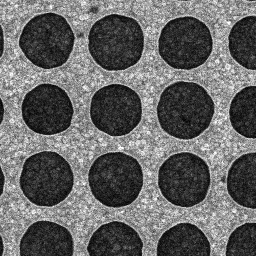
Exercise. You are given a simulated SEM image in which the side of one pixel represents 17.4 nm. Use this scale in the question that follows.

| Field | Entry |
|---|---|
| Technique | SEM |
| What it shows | a regular array of holes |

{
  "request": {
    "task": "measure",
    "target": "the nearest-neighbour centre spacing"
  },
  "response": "1190 nanometers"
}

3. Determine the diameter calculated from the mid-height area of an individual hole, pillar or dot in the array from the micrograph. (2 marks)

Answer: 0.952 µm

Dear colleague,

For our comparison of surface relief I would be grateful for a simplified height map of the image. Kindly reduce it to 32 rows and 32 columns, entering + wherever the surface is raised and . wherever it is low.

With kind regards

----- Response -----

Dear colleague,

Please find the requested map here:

++++++++++++++++++++++++++++++++
++++++++++++++++++++++++++++++++
++++....++++.....++++....+++++..
+++......++.......++......+++...
+++......++.......++......+++...
++.......++.......++.......++...
+++......++.......++......+++...
++++....++++.....+++......+++...
+++++..++++++...++++++..+++++++.
++++++++++++++++++++++++++++++++
++++++++++++++.++++++....+++++++
++++....++++.....+++......++++..
+++......++.......++.......++...
.++......++.......++.......++...
+++......++.......++.......++...
+++......+++.....+++......+++...
++++....+++++...+++++....+++++..
++++++++++++++++++++++++++++++++
++++++++++++++++++++++++++++++++
++++....+++++...+++++....+++++..
+++......+++.....+++......+++...
+++......++.......++......+++...
.+.......++.......++......++....
+++......++.......++......++....
+++.....++++.....+++......+++...
++++...++++++...++++++...+++++..
++++++++++++++++++++++++++++++++
++++++++++++++++++++++++++++++++
++++....++++.....++++....+++++..
+++......++......+++......+++...
++.......++.......++......++....
++.......++.......++......++....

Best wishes